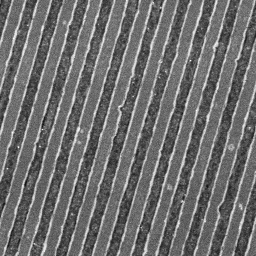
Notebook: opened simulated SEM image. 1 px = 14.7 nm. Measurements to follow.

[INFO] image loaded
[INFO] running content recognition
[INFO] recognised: parallel lines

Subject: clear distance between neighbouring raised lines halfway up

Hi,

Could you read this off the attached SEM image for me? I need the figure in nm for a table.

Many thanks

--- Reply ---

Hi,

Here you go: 168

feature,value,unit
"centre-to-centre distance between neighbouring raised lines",360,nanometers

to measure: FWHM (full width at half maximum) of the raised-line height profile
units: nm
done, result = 193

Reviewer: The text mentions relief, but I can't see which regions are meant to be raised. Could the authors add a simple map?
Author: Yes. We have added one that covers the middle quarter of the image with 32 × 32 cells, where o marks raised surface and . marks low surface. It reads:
..ooo...ooo...oooo...ooo...ooo..
.ooo....ooo...ooo...oooo...ooo..
.ooo...oooo...ooo...ooo....ooo..
.ooo...ooo....ooo...ooo...ooo...
.ooo...ooo...ooo....ooo...ooo...
ooo....ooo...ooo...ooo...oooo...
ooo...oooo...ooo...ooo...oooo...
ooo...ooo...oooo...ooo...ooo...o
oo....ooo...ooo...oooo...ooo...o
oo...oooo...ooo...ooo...oooo...o
oo...ooo...ooo....ooo...oooo..oo
oo...ooo...ooo...oooo...ooo...oo
o....ooo...ooo...oooo...ooo...oo
o...oooo...ooo...ooo...oooo...oo
o...ooo...ooo....ooo...ooo...ooo
o...ooo...ooo...oooo...ooo...ooo
...oooo...ooo...ooo....ooo...ooo
...ooo...oooo...ooo...ooo....ooo
...ooo...ooo....ooo...ooo...ooo.
...ooo...ooo...ooo....ooo...ooo.
..oooo...ooo...ooo...oooo...ooo.
..ooo...oooo...ooo...ooo...oooo.
.oooo...ooo...oooo...ooo...ooo..
.oooo...ooo...ooo....ooo...ooo..
.ooo...oooo...ooo...oooo..oooo..
.ooo...ooo....ooo...ooo...ooo...
.ooo...ooo...ooo....ooo...ooo...
ooo....ooo...ooo...oooo...ooo...
ooo...oooo...ooo...ooo...oooo...
ooo...ooo...oooo...ooo...ooo....
ooo...ooo...oooo..oooo...ooo...o
oo....ooo...ooo...oooo..oooo...o